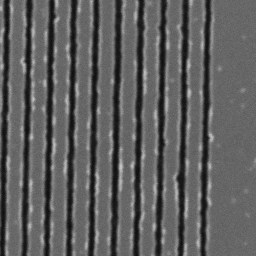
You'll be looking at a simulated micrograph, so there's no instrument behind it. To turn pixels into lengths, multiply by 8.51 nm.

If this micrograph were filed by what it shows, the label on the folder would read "parallel lines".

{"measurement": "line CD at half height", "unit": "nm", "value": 135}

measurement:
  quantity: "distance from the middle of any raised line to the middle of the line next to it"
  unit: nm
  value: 190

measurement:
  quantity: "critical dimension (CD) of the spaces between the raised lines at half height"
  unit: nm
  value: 58.5